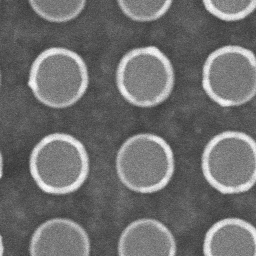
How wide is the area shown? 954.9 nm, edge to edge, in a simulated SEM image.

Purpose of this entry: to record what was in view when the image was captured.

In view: raised bodies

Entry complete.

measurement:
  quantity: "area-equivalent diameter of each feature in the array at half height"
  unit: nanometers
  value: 216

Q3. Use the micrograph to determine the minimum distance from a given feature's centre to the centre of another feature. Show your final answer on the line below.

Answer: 322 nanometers